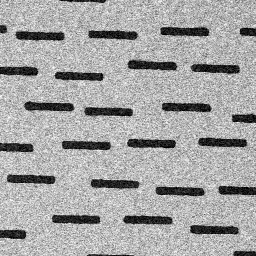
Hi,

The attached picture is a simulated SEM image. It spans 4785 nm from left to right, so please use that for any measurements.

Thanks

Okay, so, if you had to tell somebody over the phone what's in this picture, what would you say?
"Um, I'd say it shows a regular array of holes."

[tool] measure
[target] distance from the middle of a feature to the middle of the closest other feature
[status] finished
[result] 899 nanometers